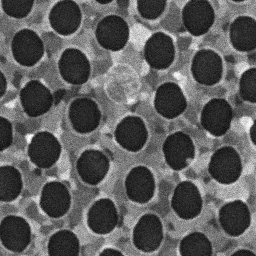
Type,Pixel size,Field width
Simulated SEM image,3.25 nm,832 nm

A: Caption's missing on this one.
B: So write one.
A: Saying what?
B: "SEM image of a regular array of holes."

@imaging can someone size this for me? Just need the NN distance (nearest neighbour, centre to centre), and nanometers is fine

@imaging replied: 162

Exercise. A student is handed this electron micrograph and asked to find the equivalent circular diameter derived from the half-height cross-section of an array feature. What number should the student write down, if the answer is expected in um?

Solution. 0.119